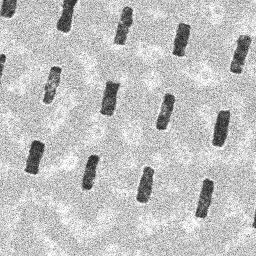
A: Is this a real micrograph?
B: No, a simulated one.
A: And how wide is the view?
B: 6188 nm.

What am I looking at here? a regular array of holes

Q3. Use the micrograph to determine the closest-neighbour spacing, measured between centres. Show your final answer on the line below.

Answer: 58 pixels